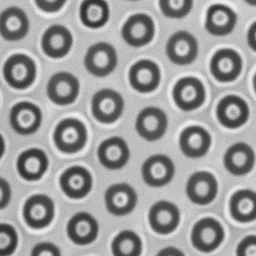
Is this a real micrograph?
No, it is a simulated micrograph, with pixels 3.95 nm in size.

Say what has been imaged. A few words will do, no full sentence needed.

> a regular array of ring-shaped grooves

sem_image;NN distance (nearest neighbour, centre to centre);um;0.184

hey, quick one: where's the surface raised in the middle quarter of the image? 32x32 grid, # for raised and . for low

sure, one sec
#####...##...####.......########
######......####...##...########
..#####....#####...###..########
...#############..####..######..
....############...##...####....
#...#############......#####...#
##..#####...######.....####...##
#...####......#############..###
...####........############...##
...####..###...#############....
#######..####..#############....
#######..###...#####.....####...
#######.......#####......#######
########......####..###...######
....#####....#####..###...######
.....#############..###...######
###...############...##...####..
###...#############......####...
###...#####...######....#####..#
###...###......##############..#
.....####.......#############...
....####...###..#############...
########...###..##############..
#########..###..#####.....######
#########.......####.......#####
##..######.....#####..###..#####
#.....#############...###...####
.......############...###..#####
..##...#############...#...####.
.####..#############......#####.
..##...#####.....####....######.
.......###........############..